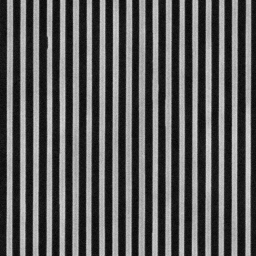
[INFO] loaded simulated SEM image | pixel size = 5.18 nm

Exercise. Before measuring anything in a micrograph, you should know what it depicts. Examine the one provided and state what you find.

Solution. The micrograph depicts parallel lines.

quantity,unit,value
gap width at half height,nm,40.8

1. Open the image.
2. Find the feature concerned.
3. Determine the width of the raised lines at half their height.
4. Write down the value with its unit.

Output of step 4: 0.0259 microns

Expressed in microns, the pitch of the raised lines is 0.0687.